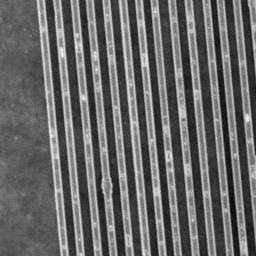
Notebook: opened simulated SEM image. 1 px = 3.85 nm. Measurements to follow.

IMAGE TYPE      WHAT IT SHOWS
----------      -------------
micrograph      parallel lines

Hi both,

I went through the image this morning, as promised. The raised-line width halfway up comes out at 6.7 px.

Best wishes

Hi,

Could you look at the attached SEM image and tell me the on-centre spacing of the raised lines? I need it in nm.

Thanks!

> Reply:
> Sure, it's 62.5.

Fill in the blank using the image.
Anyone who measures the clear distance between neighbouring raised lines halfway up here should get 35.4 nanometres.